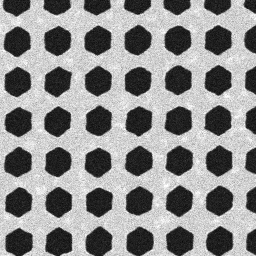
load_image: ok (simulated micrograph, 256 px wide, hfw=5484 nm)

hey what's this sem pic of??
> a regular array of holes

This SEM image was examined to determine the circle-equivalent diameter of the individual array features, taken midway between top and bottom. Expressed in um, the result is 0.606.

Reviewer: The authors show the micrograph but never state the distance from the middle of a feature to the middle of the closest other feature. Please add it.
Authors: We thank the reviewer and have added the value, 851 nanometres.